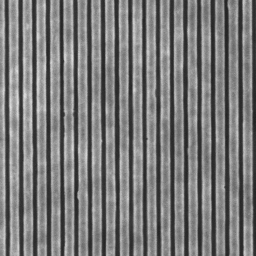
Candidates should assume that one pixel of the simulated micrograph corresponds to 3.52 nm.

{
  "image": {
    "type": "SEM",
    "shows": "parallel lines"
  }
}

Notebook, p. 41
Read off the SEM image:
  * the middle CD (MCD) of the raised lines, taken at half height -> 31.6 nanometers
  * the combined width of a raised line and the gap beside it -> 0.0483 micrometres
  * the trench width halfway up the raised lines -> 17.1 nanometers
